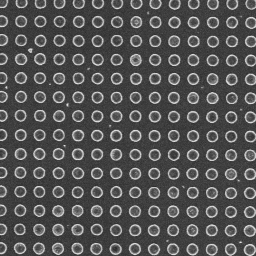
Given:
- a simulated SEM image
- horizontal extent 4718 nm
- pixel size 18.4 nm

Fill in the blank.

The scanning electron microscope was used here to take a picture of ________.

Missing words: a regular array of raised bodies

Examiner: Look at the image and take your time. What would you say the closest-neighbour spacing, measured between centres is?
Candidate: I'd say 346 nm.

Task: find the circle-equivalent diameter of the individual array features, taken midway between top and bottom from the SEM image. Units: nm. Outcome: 203